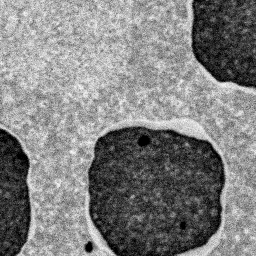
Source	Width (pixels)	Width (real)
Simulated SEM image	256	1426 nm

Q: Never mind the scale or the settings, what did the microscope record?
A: holes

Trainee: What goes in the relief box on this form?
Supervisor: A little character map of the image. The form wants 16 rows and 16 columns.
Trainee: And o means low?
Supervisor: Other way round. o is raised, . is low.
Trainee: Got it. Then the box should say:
oooooooooooo....
oooooooooooo....
oooooooooooo....
oooooooooooo....
ooooooooooooo...
ooooooooooooooo.
oooooooooooooooo
oooooooooooooooo
.ooooo.......ooo
..oooo........oo
..oooo........oo
..oooo........oo
..oooo........oo
..oooo........oo
..oooo........oo
.oooooo......ooo